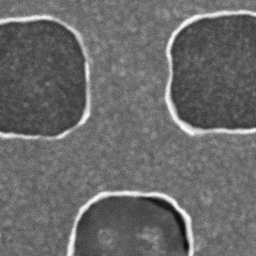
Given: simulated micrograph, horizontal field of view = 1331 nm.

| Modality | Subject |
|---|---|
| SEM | holes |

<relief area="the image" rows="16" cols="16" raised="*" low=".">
****************
....********....
.....******.....
.....******.....
.....******.....
.....******.....
.....******.....
.....******.....
**.*************
****************
****************
****************
******....******
*****......*****
*****.**....****
********....****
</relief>